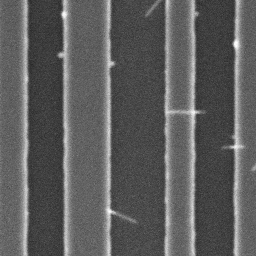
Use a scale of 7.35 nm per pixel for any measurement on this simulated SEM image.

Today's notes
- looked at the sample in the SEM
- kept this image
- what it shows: lines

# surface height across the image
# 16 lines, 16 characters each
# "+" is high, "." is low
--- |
++..+++...++...+
++..+++...++...+
++..+++...++...+
++..+++...++...+
++..+++...++...+
++..+++...++...+
++..+++...++...+
++..+++...++...+
++..+++...++...+
++..+++...++...+
++..+++...++...+
++..+++...++...+
++..+++...++...+
++..+++...++...+
++..+++...++...+
++..+++...++...+